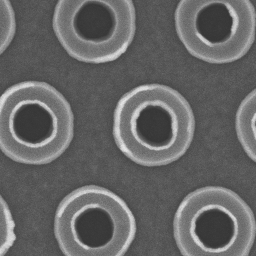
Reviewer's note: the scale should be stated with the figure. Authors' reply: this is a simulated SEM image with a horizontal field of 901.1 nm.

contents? ring-shaped raised bodies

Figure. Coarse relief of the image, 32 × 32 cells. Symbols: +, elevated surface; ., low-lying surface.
+......++++..+++.......++++.+++.
+......+++....+++.....+++....+++
++.....++.....+++.....+++....+++
++.....++.....+++.....+++....+++
+......+++....+++.....+++....+++
+.......++++++++.......++++++++.
.........++++++.........++++++..
..........++++............+++...
................................
................................
...++...........................
.++++++.........++++++..........
++++++++.......++++++++........+
+++..++++......+++..++++......++
++....+++.....+++....+++......++
++.....++.....+++....+++......++
++....+++.....+++.....++......++
+++..++++......+++...+++......++
++++++++.......++++++++........+
..+++++.........++++++.........+
................................
................................
................................
..........................+.....
.........++++++.........+++++...
+.......++++++++.......+++++++..
+......+++...+++......+++...+++.
++.....+++....+++.....+++....+++
++.....++.....+++.....++.....+++
++.....+++....+++.....+++....+++
++......+++..+++......+++...+++.
........+++++++........++++++++.